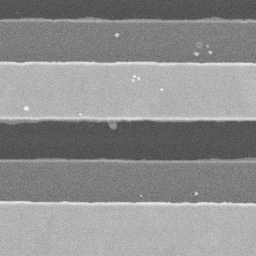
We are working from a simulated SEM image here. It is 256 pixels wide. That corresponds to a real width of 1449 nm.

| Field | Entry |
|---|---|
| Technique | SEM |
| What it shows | lines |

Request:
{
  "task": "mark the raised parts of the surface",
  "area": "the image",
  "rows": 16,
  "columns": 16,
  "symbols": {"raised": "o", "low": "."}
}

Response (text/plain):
................
oooooooooooooooo
oooooooooooooooo
oooooooooooooooo
oooooooooooooooo
oooooooooooooooo
oooooooooooooooo
...........o....
................
................
oooooooooooooooo
oooooooooooooooo
oooooooooooooooo
oooooooooooooooo
oooooooooooooooo
oooooooooooooooo